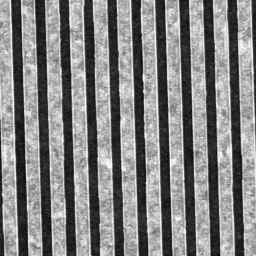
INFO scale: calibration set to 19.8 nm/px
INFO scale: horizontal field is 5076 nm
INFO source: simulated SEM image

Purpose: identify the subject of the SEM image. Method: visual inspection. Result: parallel lines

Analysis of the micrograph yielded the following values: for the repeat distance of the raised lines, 476 nm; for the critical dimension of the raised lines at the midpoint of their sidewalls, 255 nanometres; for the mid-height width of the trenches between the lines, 0.218 micrometres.